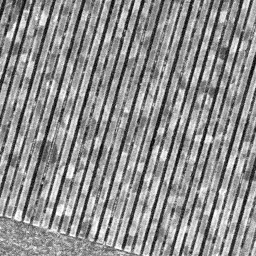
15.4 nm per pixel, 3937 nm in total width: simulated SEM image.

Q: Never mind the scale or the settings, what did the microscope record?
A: parallel lines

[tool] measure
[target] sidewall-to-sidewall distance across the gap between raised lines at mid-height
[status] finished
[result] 68.5 nm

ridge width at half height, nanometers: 83.3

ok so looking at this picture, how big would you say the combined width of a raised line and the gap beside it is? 9.52 pixels